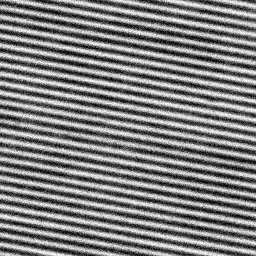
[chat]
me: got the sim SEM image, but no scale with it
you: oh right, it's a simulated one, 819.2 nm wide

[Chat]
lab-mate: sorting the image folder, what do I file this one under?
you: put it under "parallel lines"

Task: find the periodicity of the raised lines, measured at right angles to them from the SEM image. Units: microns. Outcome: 0.0298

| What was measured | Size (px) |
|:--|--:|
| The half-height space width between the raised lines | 5.91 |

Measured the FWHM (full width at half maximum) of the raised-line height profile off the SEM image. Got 10.6 nm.